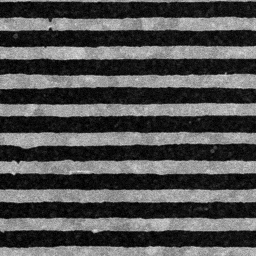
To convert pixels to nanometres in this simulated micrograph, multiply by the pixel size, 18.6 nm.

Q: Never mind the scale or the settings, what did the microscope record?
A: parallel lines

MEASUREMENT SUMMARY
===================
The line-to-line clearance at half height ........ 315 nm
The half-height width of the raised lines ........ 214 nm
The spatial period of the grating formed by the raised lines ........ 28.6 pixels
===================